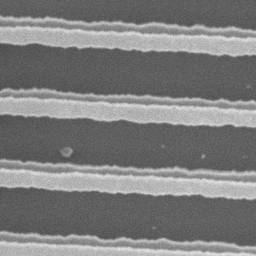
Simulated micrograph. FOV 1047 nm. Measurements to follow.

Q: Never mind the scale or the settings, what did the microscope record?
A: lines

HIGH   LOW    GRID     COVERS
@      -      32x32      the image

--------------------------------
--------------------------------
@@@@@@@@------------------------
@@@@@@@@@@@@@@@@@@@@@@@@@@------
@@@@@@@@@@@@@@@@@@@@@@@@@@@@@@@@
--@--@@@@@@@@@@@@@@@@@@@@@@@@@@@
------------------------@@@@@@@@
--------------------------------
--------------------------------
--------------------------------
--------------------------------
@@@@@@@-------------------------
@@@@@@@@@@@@@@@@@@@@@@@@@@------
@@@@@@@@@@@@@@@@@@@@@@@@@@@@@@@@
---@@-@@@@@@@@@@@@@@@@@@@@@@@@@@
-----------------------@@@@@@@@@
--------------------------------
--------------------------------
--------------------------------
--------------------------------
@@@@@---------------------------
@@@@@@@@@@@@@@@@@@@@@@@@@@------
@@@@@@@@@@@@@@@@@@@@@@@@@@@@@@@@
-----@@@@@@@@@@@@@@@@@@@@@@@@@@@
--------------------------@@@@@@
--------------------------------
--------------------------------
--------------------------------
--------------------------------
@@@@@----@----------------------
@@@@@@@@@@@@@@@@@@@@@@@@@@@@----
@@@@@@@@@@@@@@@@@@@@@@@@@@@@@@@@